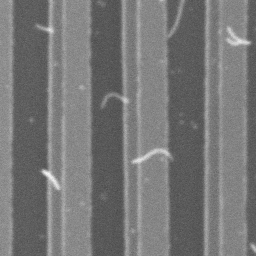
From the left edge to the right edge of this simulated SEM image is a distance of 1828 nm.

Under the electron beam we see lines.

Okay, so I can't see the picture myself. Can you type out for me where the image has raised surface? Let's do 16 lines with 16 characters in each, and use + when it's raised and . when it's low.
+..+++..++...++.
+..+++..++...++.
+..+++..++...++.
+..+++..++...++.
+..+++..++...++.
+..+++..++...++.
+..+++..++...++.
+..+++..++...++.
+..+++..++...++.
+..+++..++...++.
+..+++..++...++.
+..+++..++...++.
+..+++..++...++.
+..+++..+++..++.
+..+++..+++..++.
+..+++..+++..++.